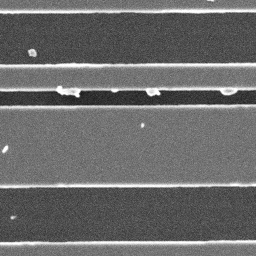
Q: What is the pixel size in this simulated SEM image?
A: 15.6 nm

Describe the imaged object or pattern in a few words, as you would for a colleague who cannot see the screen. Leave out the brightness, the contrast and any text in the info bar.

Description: lines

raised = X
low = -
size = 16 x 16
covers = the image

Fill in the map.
XXXXXXXXXXXXXXXX
----------------
----------------
----------------
XXXXXXXXXXXXXXXX
XXXXXXXXXXXXXXXX
XXXXXXXXXXXXXXXX
XXXXXXXXXXXXXXXX
XXXXXXXXXXXXXXXX
XXXXXXXXXXXXXXXX
XXXXXXXXXXXXXXXX
XXXXXXXXXXXXXXXX
----------------
----------------
----------------
XXXXXXXXXXXXXXXX